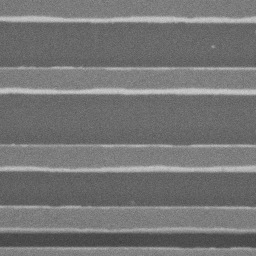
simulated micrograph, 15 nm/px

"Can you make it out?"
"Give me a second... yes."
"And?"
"lines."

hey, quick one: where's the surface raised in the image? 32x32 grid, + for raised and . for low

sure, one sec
++++++++++++++++++++++++++++++++
++++++++++++++++++++++++++++++++
........+++++++........+++.++++.
................................
................................
................................
................................
................................
..+...+++++.....................
++++++++++++++++++++++++++++++++
++++++++++++++++++++++++++++++++
.......+++......+++..........+++
................................
................................
................................
................................
................................
................................
++++++++++++++++++++++++++++++++
++++++++++++++++++++++++++++++++
++++++++++++++++++++++++++++++++
................................
................................
................................
................................
................................
++++++++++++++++++++++++++++++++
++++++++++++++++++++++++++++++++
++++++++++++++++++++++++++++++++
................................
................................
++++++++++++++++++++++++++++++++